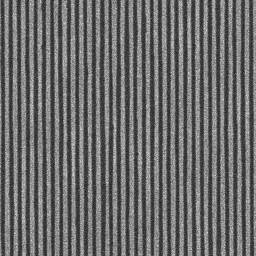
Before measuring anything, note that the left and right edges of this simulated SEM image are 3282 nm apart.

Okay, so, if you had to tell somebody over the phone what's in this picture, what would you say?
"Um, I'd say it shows parallel lines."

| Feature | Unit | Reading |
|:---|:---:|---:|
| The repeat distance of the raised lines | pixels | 8.28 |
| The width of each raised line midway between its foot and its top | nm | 44.9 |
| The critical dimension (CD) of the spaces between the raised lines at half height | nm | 56.1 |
